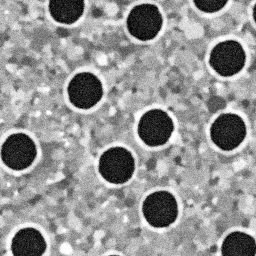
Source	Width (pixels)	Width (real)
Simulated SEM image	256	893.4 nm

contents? holes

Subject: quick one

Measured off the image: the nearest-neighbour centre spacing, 255 nanometres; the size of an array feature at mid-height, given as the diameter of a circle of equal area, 141 nanometres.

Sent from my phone